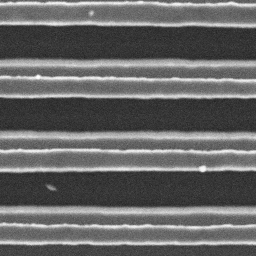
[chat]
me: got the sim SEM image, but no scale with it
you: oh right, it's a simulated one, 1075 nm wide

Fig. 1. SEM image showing lines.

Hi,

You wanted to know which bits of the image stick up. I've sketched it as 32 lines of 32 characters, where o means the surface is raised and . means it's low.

oooooooooooooooooooooooooooooooo
oooooooooooooooooooooooooooooooo
oooooooooooooooooooooooooooooooo
................................
................................
................................
................................
................................
oooooooooooooooooooooooooooooooo
oooooooooooooooooooooooooooooooo
oooooooooooooooooooooooooooooooo
oooooooooooooooooooooooooooooooo
................................
................................
................................
................................
................................
oooooooooooooooooooooooooooooooo
oooooooooooooooooooooooooooooooo
oooooooooooooooooooooooooooooooo
oooooooooooooooooooooooooooooooo
................................
................................
................................
................................
................................
oooooooooooo.............oo.....
oooooooooooooooooooooooooooooooo
oooooooooooooooooooooooooooooooo
oooooooooooooooooooooooooooooooo
................................
................................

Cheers